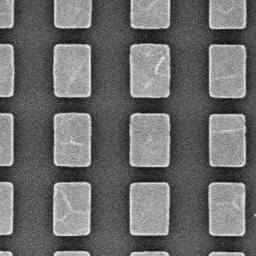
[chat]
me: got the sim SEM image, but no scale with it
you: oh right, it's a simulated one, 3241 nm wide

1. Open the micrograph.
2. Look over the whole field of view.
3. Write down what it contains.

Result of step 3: wiring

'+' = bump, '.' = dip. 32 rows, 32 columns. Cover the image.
++.....++++.....+++++.....+++++.
++.....++++.....+++++.....+++++.
++.....++++.....+++++.....+++++.
................................
................................
................................
++.....++++.....+++++.....+++++.
++.....++++.....+++++.....+++++.
++.....++++.....+++++.....+++++.
++.....++++.....+++++.....+++++.
++.....++++.....+++++.....+++++.
++.....++++.....+++++.....+++++.
................................
................................
+......++++......++++......+++..
+......++++.....+++++.....+++++.
+......++++.....+++++.....+++++.
+......++++.....+++++.....+++++.
+......++++.....+++++.....+++++.
+......++++.....+++++.....+++++.
+......++++......++++.....++++..
................................
................................
+......++++.....+++++.....+++++.
+......++++.....+++++.....+++++.
+......++++.....+++++.....+++++.
+......++++.....+++++.....++++..
+......++++.....+++++.....+++++.
+......++++.....+++++.....+++++.
................................
................................
+......++++.....................